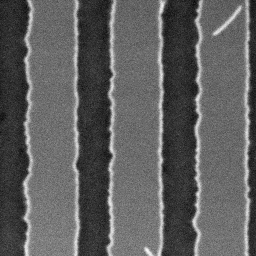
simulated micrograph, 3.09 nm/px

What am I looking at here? lines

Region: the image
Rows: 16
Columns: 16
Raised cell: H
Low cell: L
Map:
LLHHHLLHHHLLHHHL
LLHHHLLHHHLLHHHH
LLHHHLLHHHLLHHHH
LLHHHLLHHHLLHHHL
LLHHHLLHHHLLHHHH
LLHHHLLHHHLLHHHL
LLHHHLLHHHLLHHHL
LLHHHLLHHHLLHHHL
LLHHHLLHHHLLHHHL
LLHHHLLHHHLLHHHL
LLHHHLLHHHLLHHHL
LLHHHLLHHHLLHHHL
LLHHHLLHHHLLHHHH
LLHHHLLHHHLLHHHL
LLHHHLLHHHLLHHHL
LLHHHLLHHHLLHHHL